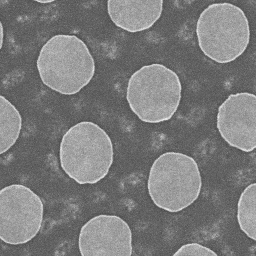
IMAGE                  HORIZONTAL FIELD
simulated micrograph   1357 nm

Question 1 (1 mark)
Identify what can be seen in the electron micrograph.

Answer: raised bodies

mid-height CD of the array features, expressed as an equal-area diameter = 0.296 µm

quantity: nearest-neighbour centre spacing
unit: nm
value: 480